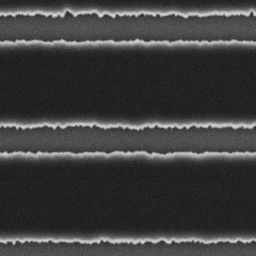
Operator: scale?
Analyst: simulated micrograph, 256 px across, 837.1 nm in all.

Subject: lines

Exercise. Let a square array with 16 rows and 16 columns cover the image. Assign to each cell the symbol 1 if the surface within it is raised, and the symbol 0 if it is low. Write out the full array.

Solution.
1111111111111111
0000000000000000
0000000000000000
1111111111111111
1111111111111111
1111111111111111
1111111111111111
1111111111111111
0000000000000000
0000000010000000
1111111111111111
1111111111111111
1111111111111111
1111111111111111
1111111111111111
0000000000000000